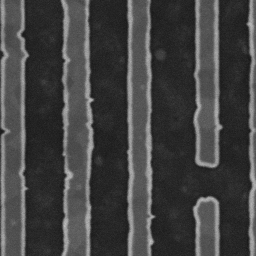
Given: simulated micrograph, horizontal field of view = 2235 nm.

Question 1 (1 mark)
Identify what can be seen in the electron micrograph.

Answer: one or a few lines or trenches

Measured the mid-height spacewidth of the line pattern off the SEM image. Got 41 pixels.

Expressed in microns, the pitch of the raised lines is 0.564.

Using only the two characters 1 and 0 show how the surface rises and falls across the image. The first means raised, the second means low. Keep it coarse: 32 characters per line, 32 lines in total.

11100000111000001110000001100001
11100000111000001110000001100001
11100000111000001110000001100001
11100000111000001110000001100001
11100000111000001110000001100001
11100000111000001100000001100001
11100000111000001110000001100001
11100000111000001110000001100000
11100000111000001110000001100001
11100000111000001110000001100001
11100000111000001110000001100001
11100000111000001110000001100001
11100000111000001110000001100001
11100000111000001110000001100001
11100000111000001110000011100001
11100000111000001110000011100001
01100000111000001110000001100001
11100000111000001110000001100001
11100000111000001110000001100001
11100000111000001110000001100001
11100000111000001110000001100001
11100000111000001110000000000001
11100000111000001110000000000000
11100000111000001110000000000000
11100000111000001110000000000001
11100000111000001110000001100001
11100000111000001110000011100001
11100000111000001110000001100001
11100000111000001110000001100001
11100000111000001110000001100001
11100000111000001110000001100001
11100000111000001110000001100001